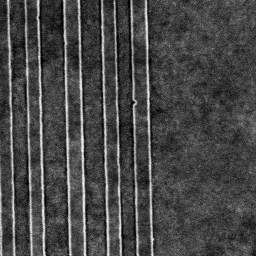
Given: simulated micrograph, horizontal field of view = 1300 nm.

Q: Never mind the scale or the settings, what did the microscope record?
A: parallel lines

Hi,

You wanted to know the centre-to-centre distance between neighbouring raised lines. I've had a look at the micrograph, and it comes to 180 nanometres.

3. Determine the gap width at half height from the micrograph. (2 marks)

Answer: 102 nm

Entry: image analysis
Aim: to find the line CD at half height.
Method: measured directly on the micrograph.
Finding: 69.8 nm